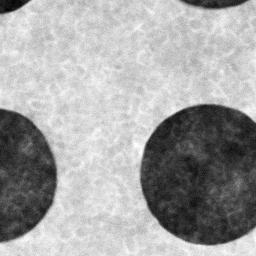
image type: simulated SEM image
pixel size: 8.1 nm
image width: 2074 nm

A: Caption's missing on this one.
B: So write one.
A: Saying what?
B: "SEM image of holes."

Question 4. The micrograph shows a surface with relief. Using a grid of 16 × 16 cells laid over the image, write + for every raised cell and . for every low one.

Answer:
.+++++++++++..++
++++++++++++++++
++++++++++++++++
++++++++++++++++
++++++++++++++++
++++++++++++++++
++++++++++++++++
..++++++++......
...++++++.......
...++++++.......
....+++++.......
....+++++.......
...++++++.......
...+++++++......
..+++++++++.....
++++++++++++++++